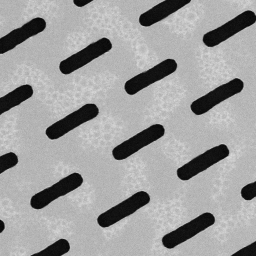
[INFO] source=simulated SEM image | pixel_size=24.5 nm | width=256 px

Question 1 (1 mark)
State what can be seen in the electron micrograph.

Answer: a regular array of holes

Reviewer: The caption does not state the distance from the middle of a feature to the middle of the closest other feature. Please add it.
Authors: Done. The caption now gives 1650 nm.